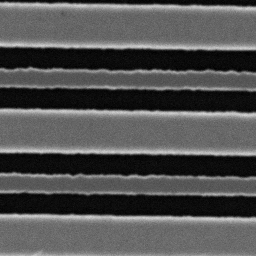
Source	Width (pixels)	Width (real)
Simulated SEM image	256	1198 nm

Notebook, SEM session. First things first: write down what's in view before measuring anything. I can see lines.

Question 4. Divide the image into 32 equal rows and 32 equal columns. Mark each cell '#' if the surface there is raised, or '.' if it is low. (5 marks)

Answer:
#####..#........................
################################
################################
################################
################################
################################
................................
................................
...#............................
################################
################################
................................
................................
................................
################################
################################
################################
################################
################################
................................
................................
................................
################################
################################
................................
................................
................................
################################
################################
################################
################################
################################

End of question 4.